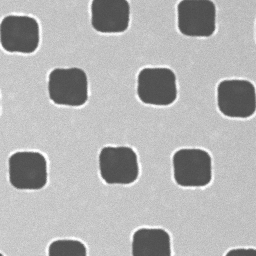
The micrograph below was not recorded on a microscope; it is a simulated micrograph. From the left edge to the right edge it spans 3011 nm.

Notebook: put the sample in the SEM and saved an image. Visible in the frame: holes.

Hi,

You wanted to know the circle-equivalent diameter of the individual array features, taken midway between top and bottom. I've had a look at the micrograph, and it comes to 489 nanometers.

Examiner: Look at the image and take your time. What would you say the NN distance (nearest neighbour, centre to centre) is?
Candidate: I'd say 1030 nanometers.